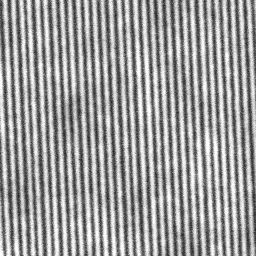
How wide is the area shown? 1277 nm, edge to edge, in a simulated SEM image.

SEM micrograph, parallel lines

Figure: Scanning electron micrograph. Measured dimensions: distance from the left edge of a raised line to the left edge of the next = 40.5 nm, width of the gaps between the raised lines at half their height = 24.9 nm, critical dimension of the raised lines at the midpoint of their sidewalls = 16.2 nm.